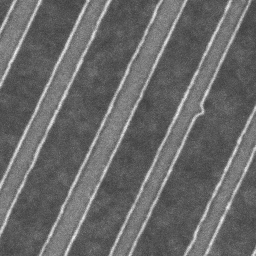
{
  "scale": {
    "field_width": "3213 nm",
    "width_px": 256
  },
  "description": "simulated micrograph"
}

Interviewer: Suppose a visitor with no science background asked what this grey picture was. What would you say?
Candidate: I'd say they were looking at one or a few lines or trenches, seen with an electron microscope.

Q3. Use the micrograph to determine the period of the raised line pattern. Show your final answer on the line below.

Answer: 814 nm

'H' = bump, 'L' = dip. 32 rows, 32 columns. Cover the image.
HHLLLHHHHHHLLHHHHHHHLLLHHHHHHLLH
HLLLHHHHHHLLLHHHHHHLLLLHHHHHLLLH
HLLLHHHHHHLLHHHHHHHLLLHHHHHHLLHH
LLLHHHHHHLLLHHHHHHHLLLHHHHHLLLHH
LLLHHHHHHLLLHHHHHHLLLHHHHHHLLHHH
LLLHHHHHLLLHHHHHHHLLLHHHHHLLLHHH
LLHHHHHHLLLHHHHHHLLLHHHHHHLLHHHH
LLHHHHHLLLHHHHHHHLLLHHHHHLLLHHHH
LHHHHHHLLLHHHHHHLLLHHHHHHLLHHHHH
LHHHHHHLLHHHHHHHLLLHHHHHLLLHHHHH
HHHHHHLLLHHHHHHLLLHHHHHHLLHHHHHH
HHHHHHLLHHHHHHHLLLHHHHHLLLHHHHHH
HHHHHLLLHHHHHHLLLHHHHHHLLHHHHHHH
HHHHHLLHHHHHHHLLLHHHHHLLLHHHHHHH
HHHHLLLHHHHHHLLLHHHHHHLLLHHHHHHL
HHHHLLHHHHHHHLLLHHHHHHLLHHHHHHHL
HHHLLLHHHHHHLLLHHHHHHLLLHHHHHHLL
HHHLLHHHHHHHLLLHHHHHHLLHHHHHHHLL
HHLLLHHHHHHLLLLHHHHHLLLHHHHHHHLL
HHLLHHHHHHHLLLHHHHHHLLHHHHHHHLLH
HLLLHHHHHHLLLLHHHHHLLLHHHHHHHLLH
HLLHHHHHHHLLLHHHHHHLLHHHHHHHLLLH
LLLHHHHHHHLLLHHHHHLLLHHHHHHHLLHH
LLLHHHHHHLLLHHHHHHLLHHHHHHHLLLHH
LLHHHHHHHLLLHHHHHLLLHHHHHHHLLHHH
LLHHHHHHLLLHHHHHHLLHHHHHHHLLLHHH
LHHHHHHHLLLHHHHHLLLHHHHHHHLLHHHH
LHHHHHHLLLHHHHHHLLHHHHHHHLLLHHHH
HHHHHHHLLLHHHHHLLLHHHHHHHLLHHHHH
HHHHHHLLLHHHHHHLLHHHHHHHLLLHHHHH
HHHHHHLLLHHHHHLLLHHHHHHHLLHHHHHH
HHHHHLLLHHHHHHLLHHHHHHHLLLHHHHHH